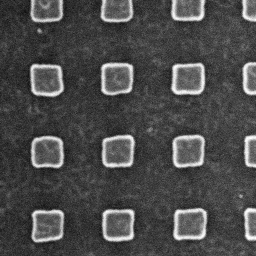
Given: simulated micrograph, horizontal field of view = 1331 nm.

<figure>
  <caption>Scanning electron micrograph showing a regular array of raised bodies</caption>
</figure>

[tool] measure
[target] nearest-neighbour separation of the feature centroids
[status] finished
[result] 70.9 pixels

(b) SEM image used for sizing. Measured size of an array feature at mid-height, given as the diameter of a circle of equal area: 171 nanometers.